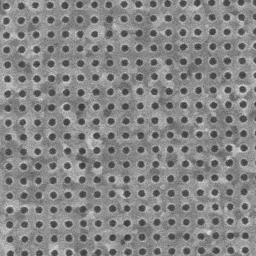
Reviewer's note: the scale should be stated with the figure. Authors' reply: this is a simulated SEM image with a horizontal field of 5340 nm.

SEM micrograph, a regular array of holes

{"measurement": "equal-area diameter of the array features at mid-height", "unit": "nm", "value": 170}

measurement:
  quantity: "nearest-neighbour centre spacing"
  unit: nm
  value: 299